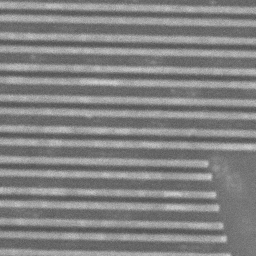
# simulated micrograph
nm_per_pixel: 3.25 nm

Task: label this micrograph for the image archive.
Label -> parallel lines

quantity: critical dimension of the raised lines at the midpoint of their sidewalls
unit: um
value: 0.0178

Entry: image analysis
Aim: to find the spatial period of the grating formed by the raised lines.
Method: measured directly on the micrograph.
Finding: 49.6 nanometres